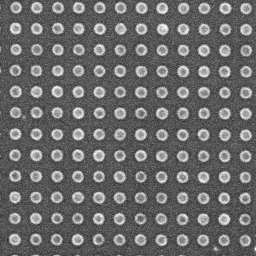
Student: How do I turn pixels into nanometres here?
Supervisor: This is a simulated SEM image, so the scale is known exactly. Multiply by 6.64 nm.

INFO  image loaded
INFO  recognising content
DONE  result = a regular array of raised bodies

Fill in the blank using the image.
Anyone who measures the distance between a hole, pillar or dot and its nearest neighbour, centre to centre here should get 138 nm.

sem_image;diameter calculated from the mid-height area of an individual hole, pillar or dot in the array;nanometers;67.8